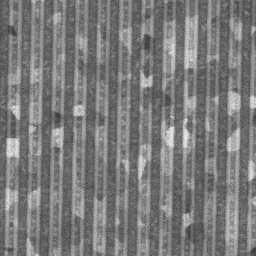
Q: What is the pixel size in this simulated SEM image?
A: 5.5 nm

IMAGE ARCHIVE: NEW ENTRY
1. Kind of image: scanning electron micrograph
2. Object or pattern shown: parallel lines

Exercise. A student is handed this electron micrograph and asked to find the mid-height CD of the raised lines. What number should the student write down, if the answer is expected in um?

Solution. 0.0516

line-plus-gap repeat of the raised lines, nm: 121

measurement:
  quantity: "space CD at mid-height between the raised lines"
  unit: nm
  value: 69.4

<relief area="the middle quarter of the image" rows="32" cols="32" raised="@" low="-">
---@@----@@---@@---@@@---@@----@
---@@----@@---@@---@@@---@@---@@
---@@----@@---@@---@@@---@@---@@
---@@----@@---@@---@@@---@@---@@
---@@----@@---@@---@@@---@@---@@
---@@----@@---@@---@@@---@@---@@
---@@----@@---@@---@@@---@@---@@
---@@----@@---@@---@@@---@@---@@
---@@----@@---@@---@@@---@@---@@
---@@----@@---@@---@@@---@@---@@
---@@---@@@---@@---@@@---@@---@@
---@@---@@@---@@---@@@---@@---@@
---@@---@@@---@@---@@@---@@---@@
---@@---@@@---@@---@@@---@@---@@
---@@---@@@---@@---@@@---@@---@@
---@@---@@----@@---@@@---@@---@@
---@@---@@----@@---@@----@@---@@
---@@---@@----@@---@@----@@---@@
---@@---@@----@@---@@----@@---@@
---@@---@@----@@---@@----@@---@@
---@@---@@----@@---@@----@@---@@
---@@---@@----@@---@@----@@---@@
---@@---@@----@@---@@----@@---@@
---@@---@@----@@---@@----@@---@@
---@@---@@----@@---@@----@@---@@
---@@---@@---@@@---@@----@@---@@
---@@---@@---@@@---@@---@@@---@@
---@@---@@---@@@---@@---@@@---@@
---@@---@@---@@@---@@---@@@---@@
---@@---@@---@@@---@@---@@@---@@
---@@---@@---@@@---@@---@@@---@@
---@@---@@---@@@---@@---@@@---@@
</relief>